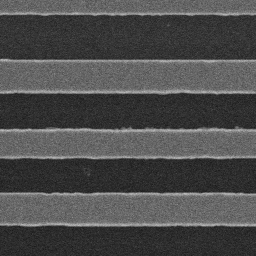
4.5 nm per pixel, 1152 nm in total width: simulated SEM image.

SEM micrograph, lines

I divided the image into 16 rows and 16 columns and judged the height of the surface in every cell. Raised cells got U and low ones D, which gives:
UUUUUUUUUUUUUUUU
DDDDDDDDDDDDDDDD
DDDDDDDDDDDDDDDD
DDDDDDDDDDDDDDDD
UUUUUUUUUUUUUUUU
UUUUUUUUUUUUUUUU
DDDDDDDDDDDDDDDD
DDDDDDDDDDDDDDDD
UUUUUUUUUUUUUUUU
UUUUUUUUUUUUUUUU
DDDDDDDDDDDDDDDD
DDDDDDDDDDDDDDDD
UUUUUUUUUUUUUUUU
UUUUUUUUUUUUUUUU
DDDDDDDDDDDDDDDD
DDDDDDDDDDDDDDDD